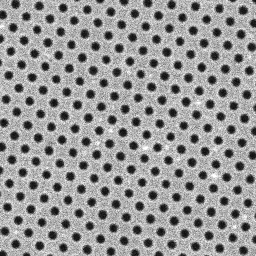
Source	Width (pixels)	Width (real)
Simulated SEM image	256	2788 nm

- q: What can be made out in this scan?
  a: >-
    a regular array of holes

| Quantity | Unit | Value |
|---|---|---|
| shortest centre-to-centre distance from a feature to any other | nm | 182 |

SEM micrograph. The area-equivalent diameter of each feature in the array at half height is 105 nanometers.